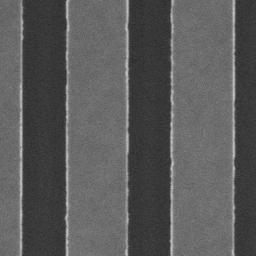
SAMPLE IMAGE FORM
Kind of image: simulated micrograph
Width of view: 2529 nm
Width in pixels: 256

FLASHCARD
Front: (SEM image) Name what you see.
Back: lines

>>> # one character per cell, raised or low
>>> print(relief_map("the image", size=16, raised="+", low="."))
+...++++...++++.
+...++++...++++.
+...++++...++++.
+...++++...++++.
+...++++...++++.
+...++++...++++.
+...++++...++++.
+...++++...++++.
+...++++...++++.
+...++++...++++.
+...++++...++++.
+...++++...++++.
+...++++...++++.
+...++++...++++.
+...++++...++++.
+...++++...++++.